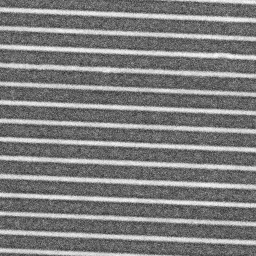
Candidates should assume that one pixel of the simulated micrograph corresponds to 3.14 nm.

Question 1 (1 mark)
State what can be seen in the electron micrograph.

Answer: parallel lines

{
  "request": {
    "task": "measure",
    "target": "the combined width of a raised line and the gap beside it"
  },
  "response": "58.2 nm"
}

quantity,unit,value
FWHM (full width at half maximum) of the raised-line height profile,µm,0.009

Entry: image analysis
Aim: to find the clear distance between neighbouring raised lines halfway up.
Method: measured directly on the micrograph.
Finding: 0.0475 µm